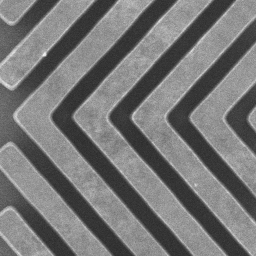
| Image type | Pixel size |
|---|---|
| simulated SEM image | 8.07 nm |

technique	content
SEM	groups of lines, slits or small figures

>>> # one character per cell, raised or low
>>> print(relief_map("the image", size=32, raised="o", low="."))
oooo...ooooo..ooooo...oooo...ooo
ooo...ooooo..ooooo...oooo...oooo
.o...ooooo..ooooo...oooo...ooooo
....ooooo...oooo...oooo...ooooo.
...ooooo...oooo...ooooo..ooooo..
...oooo...oooo...ooooo...oooo...
..oooo...oooo...ooooo...oooo...o
.oooo...oooo...ooooo...oooo...oo
oooo...oooo...ooooo...oooo...ooo
ooo...oooo...ooooo...oooo...oooo
oo...ooooo..ooooo...oooo...ooooo
....ooooo...oooo...oooo...ooooo.
...ooooo...oooo...ooooo..ooooo..
..ooooo...oooo...ooooo..ooooo...
..oooo...ooooo..ooooo...oooo...o
..ooooo...oooo...oooo...oooo...o
...ooooo...oooo...oooo...oooo...
....ooooo..ooooo...oooo...oooo..
oo...oooo...ooooo..ooooo...oooo.
ooo...oooo...oooo...ooooo..ooooo
oooo...oooo...oooo...oooo...oooo
.oooo...oooo...oooo...oooo...ooo
.ooooo...oooo...oooo...oooo...oo
..ooooo..ooooo...oooo...oooo...o
...ooooo..ooooo...oooo...oooo...
....oooo...ooooo..ooooo...oooo..
oo...oooo...oooo...ooooo..ooooo.
ooo...oooo...oooo...ooooo..ooooo
oooo...oooo...oooo...oooo...oooo
ooooo...oooo...oooo...oooo...ooo
.ooooo..ooooo...oooo...oooo...oo
..oooo...ooooo..ooooo...oooo...o